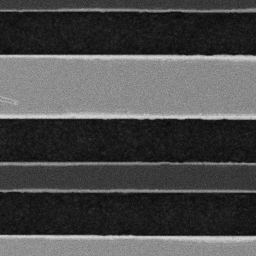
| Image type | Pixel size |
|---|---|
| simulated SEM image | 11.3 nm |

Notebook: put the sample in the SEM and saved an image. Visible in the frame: lines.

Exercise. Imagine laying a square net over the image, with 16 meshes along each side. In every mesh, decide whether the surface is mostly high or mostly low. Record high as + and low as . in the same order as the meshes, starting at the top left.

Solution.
++++++++++++++++
................
................
+++++++++++.....
++++++++++++++++
++++++++++++++++
++++++++++++++++
................
................
................
++++++++++++++++
++++++++++++++++
................
................
................
++++++++++++++++